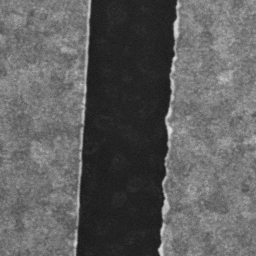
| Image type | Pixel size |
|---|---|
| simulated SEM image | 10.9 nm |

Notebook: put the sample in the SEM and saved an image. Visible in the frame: one or a few lines or trenches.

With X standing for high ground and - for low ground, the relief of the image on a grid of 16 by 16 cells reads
XXXXXX-----XXXXX
XXXXXX-----XXXXX
XXXXXX-----XXXXX
XXXXX------XXXXX
XXXXX------XXXXX
XXXXX------XXXXX
XXXXX------XXXXX
XXXXX-----XXXXXX
XXXXX------XXXXX
XXXXX-----XXXXXX
XXXXX-----XXXXXX
XXXXX-----XXXXXX
XXXXX-----XXXXXX
XXXXX-----XXXXXX
XXXXX-----XXXXXX
XXXXX-----XXXXXX